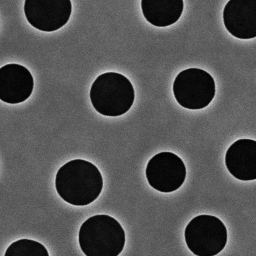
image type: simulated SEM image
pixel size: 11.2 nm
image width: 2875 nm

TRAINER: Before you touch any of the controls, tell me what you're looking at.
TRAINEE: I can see holes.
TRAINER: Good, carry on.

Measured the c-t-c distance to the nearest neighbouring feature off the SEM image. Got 954 nm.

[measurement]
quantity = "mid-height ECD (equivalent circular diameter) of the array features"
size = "0.491 micrometres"